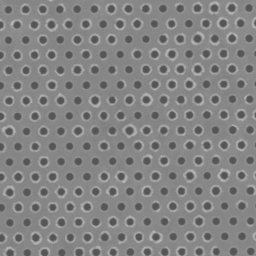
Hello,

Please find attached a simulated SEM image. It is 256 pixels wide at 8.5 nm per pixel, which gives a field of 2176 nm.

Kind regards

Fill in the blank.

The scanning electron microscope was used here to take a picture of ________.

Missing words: a regular array of holes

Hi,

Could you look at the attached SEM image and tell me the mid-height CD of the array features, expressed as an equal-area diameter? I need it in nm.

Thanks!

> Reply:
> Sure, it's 61.4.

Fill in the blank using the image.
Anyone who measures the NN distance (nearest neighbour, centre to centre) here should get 145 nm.